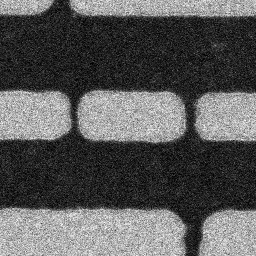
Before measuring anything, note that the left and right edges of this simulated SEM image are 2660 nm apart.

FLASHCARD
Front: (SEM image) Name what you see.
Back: one or a few lines or trenches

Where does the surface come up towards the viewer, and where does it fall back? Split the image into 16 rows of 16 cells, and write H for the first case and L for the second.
LLLHHLLLLLLLLLLL
HHHHHHHHHHHHHHHH
HHHHHHHHHHHHHHHH
HHHHHHHHHHHHHHHH
HHHHHHHHHHHHHHHH
HHHHHHHHHHHHHHHH
LLLLHLLLLLLHLLLL
LLLLHLLLLLLLLLLL
LLLLHLLLLLLHHLLL
HHHHHHHHHHHHHHHH
HHHHHHHHHHHHHHHH
HHHHHHHHHHHHHHHH
HHHHHHHHHHHHHHHH
LLLLLLLLLLLHHLLL
LLLLLLLLLLLHHLLL
LLLLLLLLLLLHHLLL